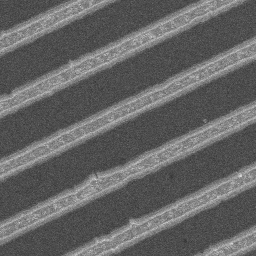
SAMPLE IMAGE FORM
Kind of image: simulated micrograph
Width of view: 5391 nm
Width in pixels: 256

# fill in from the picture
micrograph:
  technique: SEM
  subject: parallel lines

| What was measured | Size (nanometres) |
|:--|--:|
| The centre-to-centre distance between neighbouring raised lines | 1190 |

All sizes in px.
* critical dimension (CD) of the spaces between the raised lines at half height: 40.8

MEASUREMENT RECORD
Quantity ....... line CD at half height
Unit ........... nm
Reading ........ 340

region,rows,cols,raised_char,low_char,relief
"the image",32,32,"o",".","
.........oooo............oooo...
......ooooo............oooo.....
....ooooo............oooo.......
..ooooo............oooo.........
oooo............ooooo...........
oo............ooooo............o
o...........ooooo............ooo
..........ooooo............oooo.
........ooooo...........ooooo...
......oooo.............oooo.....
....oooo.............oooo.......
..ooooo...........ooooo.........
oooo............ooooo...........
oo............ooooo............o
............oooo.............ooo
..........oooo............ooooo.
........oooo............ooooo...
......oooo............ooooo.....
....oooo............ooooo.......
..oooo............ooooo.........
oooo............oooo............
oo............oooo............oo
...........ooooo............oooo
..........oooo............ooooo.
.......ooooo............ooooo...
.....ooooo............ooooo.....
...ooooo............oooo........
.ooooo............oooo..........
oooo............oooo............
oo............oooo............oo
...........ooooo............oooo
.........ooooo............oooo..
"